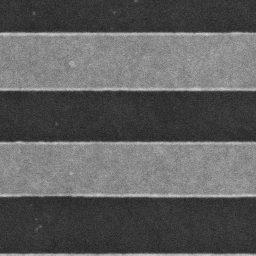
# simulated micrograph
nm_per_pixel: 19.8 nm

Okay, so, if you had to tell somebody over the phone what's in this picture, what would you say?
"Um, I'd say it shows lines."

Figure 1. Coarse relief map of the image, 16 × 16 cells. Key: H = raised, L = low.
LLLLLLLLLLLLLLLL
LLLLLLLLLLLLLLLL
HHHHHHHHHHHHHHHH
HHHHHHHHHHHHHHHH
HHHHHHHHHHHHHHHH
HHHHHHHHHHHHHHHH
LLLLLLLLLLLLLLLL
LLLLLLLLLLLLLLLL
LLLLLLLLLLLLLLLL
HHHHHHHHHHHHHHHH
HHHHHHHHHHHHHHHH
HHHHHHHHHHHHHHHH
LLLLLLLLLLLLLLLL
LLLLLLLLLLLLLLLL
LLLLLLLLLLLLLLLL
LLLLLLLLLLLLLLLL